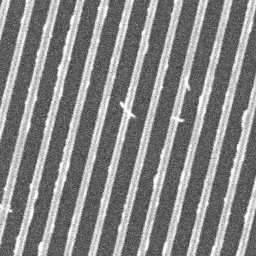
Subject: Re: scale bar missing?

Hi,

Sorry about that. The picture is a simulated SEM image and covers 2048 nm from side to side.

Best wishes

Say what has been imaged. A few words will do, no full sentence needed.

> parallel lines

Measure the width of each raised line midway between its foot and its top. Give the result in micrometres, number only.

0.0554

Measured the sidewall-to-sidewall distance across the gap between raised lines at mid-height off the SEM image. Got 0.134 um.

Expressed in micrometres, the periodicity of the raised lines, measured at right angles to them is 0.192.